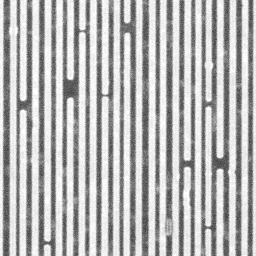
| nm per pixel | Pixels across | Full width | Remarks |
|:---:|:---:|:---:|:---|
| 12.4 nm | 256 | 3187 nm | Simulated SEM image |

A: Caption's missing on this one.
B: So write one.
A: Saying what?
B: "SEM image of parallel lines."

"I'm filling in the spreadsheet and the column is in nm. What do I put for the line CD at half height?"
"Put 60.7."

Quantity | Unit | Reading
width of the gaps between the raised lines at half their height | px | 6.88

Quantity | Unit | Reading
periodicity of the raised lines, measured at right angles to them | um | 0.144